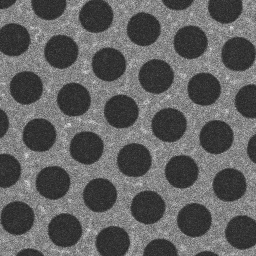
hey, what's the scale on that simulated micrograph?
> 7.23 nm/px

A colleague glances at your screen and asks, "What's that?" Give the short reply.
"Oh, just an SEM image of a regular array of holes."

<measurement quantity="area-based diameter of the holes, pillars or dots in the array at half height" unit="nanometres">244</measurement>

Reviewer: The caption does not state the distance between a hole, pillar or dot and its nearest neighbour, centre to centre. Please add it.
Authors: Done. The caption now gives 0.352 um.